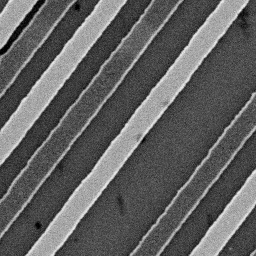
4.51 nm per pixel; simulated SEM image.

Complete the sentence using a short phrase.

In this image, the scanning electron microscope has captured lines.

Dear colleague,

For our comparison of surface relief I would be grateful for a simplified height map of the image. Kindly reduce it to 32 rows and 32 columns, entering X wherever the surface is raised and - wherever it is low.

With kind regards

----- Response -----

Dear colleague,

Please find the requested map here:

-XXX-XXXX---XXX----XXX-----XXXX-
XXXX-XXX----XXX---XXXX-----XXX--
XXX-XXXX---XXX---XXXX-----XXX---
XX-XXXX---XXX----XXX-----XXX----
X-XXXX---XXXX---XXX-----XXXX----
X-XXX---XXXX---XXXX-----XXX-----
-XXX----XXX---XXXX-----XXX------
XXXX---XXX---XXXX-----XXX-------
XXX---XXX----XXX-----XXXX-------
XX---XXXX---XXXX-----XXX--------
X---XXXX---XXXX-----XXX---------
X---XXX---XXXX-----XXX----------
---XXX----XXX-----XXXX---------X
--XXXX---XXXX----XXXX---------XX
-XXXX---XXXX-----XXX----------XX
-XXX---XXXX-----XXX----------XXX
XXX---XXXX-----XXX----------XXXX
XXX---XXX-----XXXX---------XXXX-
XX---XXXX-----XXX---------XXXX--
X---XXXX-----XXX----------XXX---
---XXXX-----XXX----------XXXX---
---XXX-----XXXX---------XXXX----
--XXXX----XXXX----------XXX----X
-XXXX-----XXX----------XXX----XX
-XXX-----XXX----------XXX----XXX
XXX-----XXXX---------XXXX----XXX
XXX-----XXX----------XXX----XXX-
XX-----XXX----------XXX----XXX--
X-----XXX----------XXX----XXXX--
-----XXXX---------XXXX----XXX---
----XXXX---------XXXX----XXX----
----XXX----------XXX----XXX-----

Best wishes